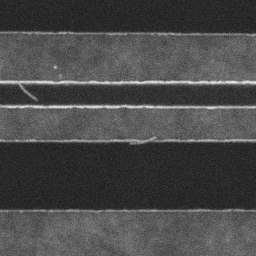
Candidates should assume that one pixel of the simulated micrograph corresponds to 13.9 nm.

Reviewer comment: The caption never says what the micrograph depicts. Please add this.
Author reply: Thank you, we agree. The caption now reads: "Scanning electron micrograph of lines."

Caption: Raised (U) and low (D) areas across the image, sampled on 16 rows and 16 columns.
UUUUUUUUUUUUUUUU
UUUUUUUUUUUUUUUU
DDDDDDDDDDDDDDDD
DDDDDDDDDDDDDDDD
DDDDDDDDDDDDDDDD
UUUUUUUUUUUUUUUU
UUUUUUUUUUUUUUUU
DDDDDDDDDDDDDDDD
DDDDDDDDDDDDDDDD
UUUUUUUUUUUUUUUU
UUUUUUUUUUUUUUUU
UUUUUUUUUUUUUUUU
UUUUUUUUUUUUUUUU
DDDDDDDDDDDDDDDD
DDDDDDDDDDDDDDDD
DDDDDDDDDDDDDDDD